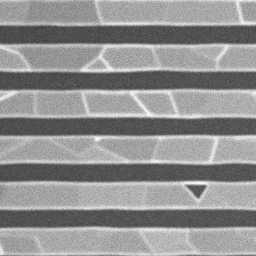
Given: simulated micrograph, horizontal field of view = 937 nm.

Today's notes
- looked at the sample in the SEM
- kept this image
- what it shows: wiring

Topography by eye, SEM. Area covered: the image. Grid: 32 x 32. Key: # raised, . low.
##############################..
##############################..
##############################..
................................
................................
................................
#############......#############
#############.......############
##############......############
................................
................................
#################....###########
#################.....##########
##################....##########
##################....##########
................................
................................
################################
################################
################################
................................
................................
................................
#######################...######
########################.#######
################################
................................
................................
..........###...................
################################
################################
################################